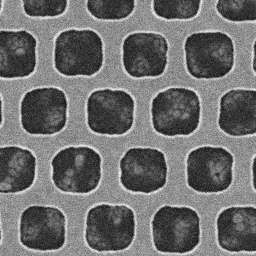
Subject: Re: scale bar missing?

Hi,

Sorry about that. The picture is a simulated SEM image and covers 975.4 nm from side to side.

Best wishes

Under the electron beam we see a regular array of holes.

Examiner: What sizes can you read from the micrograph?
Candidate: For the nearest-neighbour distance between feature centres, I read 252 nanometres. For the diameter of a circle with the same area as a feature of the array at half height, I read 50.2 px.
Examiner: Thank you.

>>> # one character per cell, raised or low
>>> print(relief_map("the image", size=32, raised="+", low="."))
+++......++......++......++.....
+++.....+++......++......++.....
+++++++++++++..++++++.++++++....
++++++++++++++++++++++++++++++++
....+++.....++++....++++....++++
.....++......++......++......+++
....+++......++......++......+++
.....++......++......++......+++
....+++......++......++......+++
....++++++.+++++....++++....++++
++++++++++++++++++++++++++++++++
+++.....++++....++++....++++....
+++.....+++......++......++.....
++.......++......++......++.....
++......+++......++......++.....
+++.....+++......++......++.....
+++....+++++....++++....++++....
++++++++++++++++++++++++++++++++
...+++++....+++++.+++++++...++++
....+++.....+++......++......+++
....++.......++......++......+++
....++.......++......++......++.
....+++......++......++......+++
+...+++.....++++....++++....++++
++++++++++++++++++++++++++++++++
++++++++++++++++++++++++++++++++
+++.....+++......+++....++++....
+++.....+++......++......++.....
++......+++......++......++.....
++......+++......++......++.....
+++.....+++.....+++......++.....
++++++++++++++++++++....+++++.++